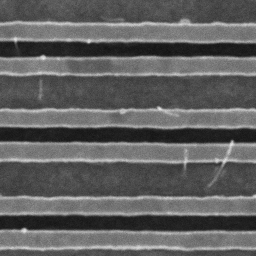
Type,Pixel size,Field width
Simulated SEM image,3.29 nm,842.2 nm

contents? lines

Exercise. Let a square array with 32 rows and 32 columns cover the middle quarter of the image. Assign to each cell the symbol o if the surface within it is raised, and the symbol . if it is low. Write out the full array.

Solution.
oooooooooooooooooooooooooooooooo
oooooooooooooooooooooooooooooooo
oooooooooooooooooooooooooooooooo
................................
................................
................................
................................
................................
................................
................................
................................
oooooooooo...ooooooooooooooooo.o
oooooooooooooooooooooooooooooooo
oooooooooooooooooooooooooooooooo
oooooooooooooooooooooooooooooooo
oooooooooooooooooooooooooooooooo
................................
................................
................................
................................
oooooooooooooooooooooooooooooooo
oooooooooooooooooooooooooooooooo
oooooooooooooooooooooooooooooooo
oooooooooooooooooooooooooooooooo
.........................oooooo.
................................
................................
................................
................................
................................
................................
................................